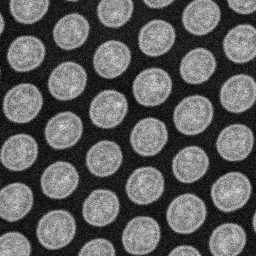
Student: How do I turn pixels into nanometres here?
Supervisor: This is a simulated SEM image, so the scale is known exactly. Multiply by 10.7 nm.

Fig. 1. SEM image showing a regular array of raised bodies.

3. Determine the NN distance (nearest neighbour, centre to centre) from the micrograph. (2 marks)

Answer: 527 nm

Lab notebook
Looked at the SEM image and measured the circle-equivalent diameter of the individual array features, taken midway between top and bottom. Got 0.389 micrometres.